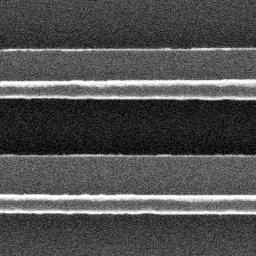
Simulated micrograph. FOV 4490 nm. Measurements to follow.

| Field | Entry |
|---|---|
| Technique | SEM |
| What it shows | lines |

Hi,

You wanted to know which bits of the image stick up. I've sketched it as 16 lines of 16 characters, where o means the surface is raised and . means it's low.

................
................
................
oooooooooooooooo
oooooooooooooooo
oooooooooooooooo
................
................
................
................
oooooooooooooooo
oooooooooooooooo
oooooooooooooooo
................
................
................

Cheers